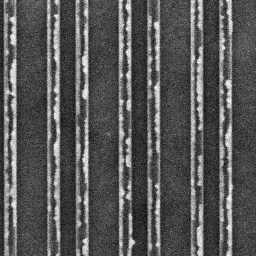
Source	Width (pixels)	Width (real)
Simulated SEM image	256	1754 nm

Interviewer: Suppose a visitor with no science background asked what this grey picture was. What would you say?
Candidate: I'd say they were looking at parallel lines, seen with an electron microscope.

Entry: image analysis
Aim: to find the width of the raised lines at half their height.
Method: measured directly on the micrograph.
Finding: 79.6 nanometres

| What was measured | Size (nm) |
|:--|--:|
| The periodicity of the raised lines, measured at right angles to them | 246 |